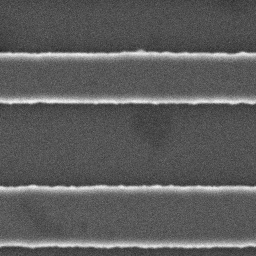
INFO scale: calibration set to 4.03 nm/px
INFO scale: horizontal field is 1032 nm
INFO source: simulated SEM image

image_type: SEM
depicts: lines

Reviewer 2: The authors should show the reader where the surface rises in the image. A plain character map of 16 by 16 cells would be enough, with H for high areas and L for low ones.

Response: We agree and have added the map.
LLLLLLLLLLLLLLLL
LLLLLLLLLLLLLLLL
LLLLLLLLLLLLLLLL
HHHHHHHHHHHHHHHH
HHHHHHHHHHHHHHHH
HHHHHHHHHHHHHHHH
LLLLLLLLLLLLLLLL
LLLLLLLLLLLLLLLL
LLLLLLLLLLLLLLLL
LLLLLLLLLLLLLLLL
LLLLLLLLLLLLLLLL
LLLLLLLLLLLLLLLL
HHHHHHHHHHHHHHHH
HHHHHHHHHHHHHHHH
HHHHHHHHHHHHHHHH
LLLLLLLLLLLLLLLL